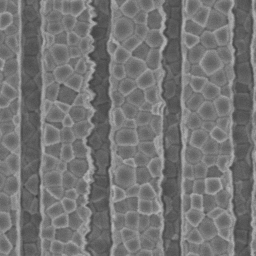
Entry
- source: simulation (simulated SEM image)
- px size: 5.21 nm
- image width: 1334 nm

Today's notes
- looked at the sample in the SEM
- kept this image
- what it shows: one or a few lines or trenches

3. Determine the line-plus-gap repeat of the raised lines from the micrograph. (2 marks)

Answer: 70.8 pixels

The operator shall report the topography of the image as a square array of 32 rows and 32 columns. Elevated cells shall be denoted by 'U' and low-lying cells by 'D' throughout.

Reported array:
UUUDDUUUUUUDDDUUUUUUDDDUUUUUUDDD
UUDDDUUUUUUUDDUUUUUUUDDUUUUUUDDD
UUUDDUUUUUUUDDUUUUUUUDDUUUUUUDDD
UUUDDUUUUUUUDDUUUUUUUDDUUUUUUDDD
UUUDDUUUUUUDDDUUUUUUUDDUUUUUUDDD
UUUDDUUUUUUUDUUUUUUUUDDUUUUUUDDU
UUUDDUUUUUUDDDUUUUUUDDDUUUUUUDDU
UUUDDUUUUUUDDDUUUUUUDDDUUUUUUDDU
UUUDDUUUUUUUDDUUUUUUDDDUUUUUUDDD
UUUDDUUUUUUDDDUUUUUUDDDUUUUUUDDD
UUUDDUUUUUUDDDUUUUUUDDDUUUUUUDDD
UUUDDUUUUUUDDDUUUUUUDDDUUUUUUDDD
UUUDDUUUUUUDDDUUUUUUDDDUUUUUUDDD
UUUDDUUUUUUUDDUUUUUUDDDUUUUUUDDD
UUUDDUUUUUUUDDUUUUUUDDDUUUUUUDDD
UUUDDUUUUUUDDDUUUUUUDDDUUUUUUDDD
UUDDDUUUUUUDDDUUUUUUDDDUUUUUUDDD
UUDDDUUUUUUDDDUUUUUUDDDUUUUUUDDD
UUUDDUUUUUUDDDUUUUUUDDDUUUUUUDDD
UUUDDUUUUUUDDDUUUUUUDDDUUUUUUDDD
UUUDDUUUUUUUDDUUUUUUDDDUUUUUUDDD
UUUDDUUUUUUUDDUUUUUUDDDUUUUUUDDD
UUUDDUUUUUUUDDUUUUUUDDDUUUUUUDDD
UUUDDUUUUUUDDDUUUUUUDDDUUUUUUDDD
UUUDDUUUUUUDDDUUUUUUDDDUUUUUUDDU
UUUDDUUUUUUDDDUUUUUUDDDUUUUUUDDU
UUUDDUUUUUUDDDUUUUUUDDDUUUUUUDDU
UUDDDUUUUUUDDDUUUUUUDDDUUUUUUDDU
UUDDDUUUUUUDDDUUUUUUDDDUUUUUUDDD
UUDDDUUUUUUDDDUUUUUUDDDUUUUUUDDU
UUDDDUUUUUUDDDUUUUUUDDDUUUUUUDDU
UUDDDUUUUUUDDDUUUUUUDDDUUUUUUDDU